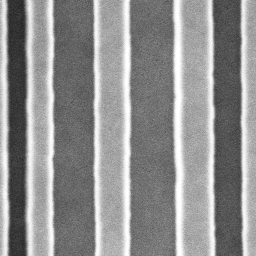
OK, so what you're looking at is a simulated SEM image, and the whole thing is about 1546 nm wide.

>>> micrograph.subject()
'lines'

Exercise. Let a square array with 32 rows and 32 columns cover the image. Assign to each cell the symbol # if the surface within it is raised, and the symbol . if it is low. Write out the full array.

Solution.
#...##......####......####....##
#...##......####......####....##
#...##......####......####....##
#...##......####......####....##
#...###.....####......####....##
#..####.....####......####....##
#..####.....####......####....##
#...###.....####......####....##
#...##......####......####....##
#...##......####......####....##
#...##......####......####....##
#...###.....####......####....##
#...###.....####......####....##
#...##......####......#####...##
#...##......####......#####...##
#...###.....####......####....##
#...###.....####......#####...##
#...###.....####......#####...##
#...###.....####......#####...##
#...###.....####......#####...##
#...##......####......#####...##
#...###.....####......#####...##
#...###.....####......#####...##
#...##......####......#####...##
#...##......####......#####...##
#...###.....####......#####...##
#...###.....####......#####...##
#...##......####......#####....#
#...###.....####......#####...##
#...###.....####......#####...##
#...###.....####......#####...##
#...###.....####......#####....#